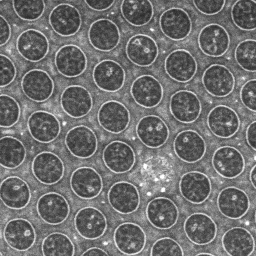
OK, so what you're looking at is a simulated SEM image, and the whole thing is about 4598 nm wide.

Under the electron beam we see a regular array of raised bodies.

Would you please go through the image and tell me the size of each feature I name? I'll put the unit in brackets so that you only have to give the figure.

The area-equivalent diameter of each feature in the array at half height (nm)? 564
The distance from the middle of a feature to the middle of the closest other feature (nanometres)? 728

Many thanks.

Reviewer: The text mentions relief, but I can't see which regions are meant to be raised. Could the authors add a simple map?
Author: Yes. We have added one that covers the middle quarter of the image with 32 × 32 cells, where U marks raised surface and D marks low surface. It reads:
UUUUUDDDUUUUUUDDDDDDDDDDDUUUUUUU
UUUUUDDUUUUUUUUDDDDDDDDDDUUUUUUU
UUUUDDDUUUUUUUUDDDDDDDDDDDUUUUUU
DDDDDDDUUUUUUUUDDDDUUUDDDDDUUUUU
DDDDDDDDUUUUUUUDDUUUUUUUDDDDDDDD
DDDDDDDDDUUUUUUDDUUUUUUUDDDDDDDD
UUUUUUDDDDUUUUDDDUUUUUUUUDDDDDDD
UUUUUUDDDDDDDDDDDUUUUUUUUDDDUUUU
UUUUUUUDDDDDDDDDDUUUUUUUDDDUUUUU
UUUUUUUDDDDUUDDDDDUUUUUUDDDUUUUU
UUUUUUUDDUUUUUUDDDDDUUUDDDDUUUUU
UUUUUUUDDUUUUUUUDDDDDDDDDDDUUUUU
DUUUUUDDDUUUUUUUDDDDDDDDDDDUUUUU
DDDDDDDDDUUUUUUUDDDDUUUUDDDDUUUU
DDDDDDDDDUUUUUUUDDDUUUUUUDDDDDUU
DDDDUDDDDUUUUUUUDDUUUUUUUUDDDDDD
DDUUUUUDDDDUUUUDDDUUUUUUUUDDDDDD
DUUUUUUDDDDDDDDDDDUUUUUUUUDDDUUU
UUUUUUUUDDDDDDDDDDDUUUUUUUDDUUUU
UUUUUUUUDDDDUUDDDDDDUUUUUDDDUUUU
DUUUUUUUDDDUUUUUDDDDDUUUDDDDUUUU
DUUUUUUUDDUUUUUUUDDDDDDDDDDDUUUU
DDUUUUUDDDUUUUUUUDDDDDDDDDDDUUUU
DDDDDDDDDDUUUUUUUUDDDDDDDDDDDUUU
DDDDDDDDDDUUUUUUUUDDDDDDDDDDDDDU
DDDDDDDDDDDUUUUUUDDDDDDDDDDDDDDD
DDDUUUUDDDDDUUUUDDDDDDDDDDDDDDDD
DDUUUUUUDDDDDDDDDDDDDDDDDDDDDDUU
DDUUUUUUUDDDDDDDDDDDDDDDDDDDDUUU
DDUUUUUUUDDDDDDDDDDDDDDDDDDDDUUU
DDUUUUUUUDDDUUUUUDDDDDDDDDDDDUUU
DDUUUUUUUDDDUUUUUUDDDDDDDDDDDUUU